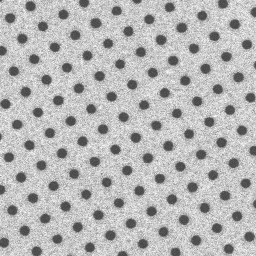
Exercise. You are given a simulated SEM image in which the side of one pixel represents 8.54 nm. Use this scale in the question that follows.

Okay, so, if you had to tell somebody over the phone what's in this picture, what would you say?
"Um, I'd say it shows a regular array of holes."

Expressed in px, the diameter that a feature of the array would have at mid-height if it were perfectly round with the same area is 9.78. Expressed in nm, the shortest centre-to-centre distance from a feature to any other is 202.